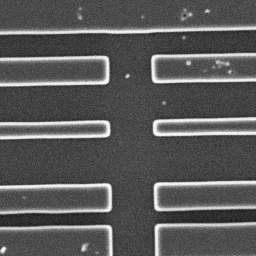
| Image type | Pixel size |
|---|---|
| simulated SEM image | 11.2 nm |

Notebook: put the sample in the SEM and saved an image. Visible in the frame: groups of lines, slits or small figures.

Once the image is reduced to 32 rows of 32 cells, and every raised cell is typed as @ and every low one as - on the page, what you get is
@@@@@@@@@@@@@@@@@@@@@@@@@@@@@@@@
@@@@@@@@@@@@@@@@@@@@@@@@@@@@@@@@
@@@@@@@@@@@@@@@@@@@@@@@@@@@@@@@@
@@@@@@@@@@@@@@@@@@@@@@@@@@@@@@@@
--------------------------------
--------------------------------
--------------------------------
@@@@@@@@@@@@@------@@@@@@@@@@@@@
@@@@@@@@@@@@@------@@@@@@@@@@@@@
@@@@@@@@@@@@@------@@@@@@@@@@@@@
@@@@@---------------------------
--------------------------------
--------------------------------
--------------------------------
--------------------------------
@@@-@@@@@@@@@------@@@@@@@@@@@@@
@@@@@@@@@@@@@@-----@@@@@@@@@@@@@
--------------------------------
--------------------------------
--------------------------------
--------------------------------
--------------------------------
--------------------------------
@@@@@@@@@@@@@@-----@@@@@@@@@@@@@
@@@@@@@@@@@@@@-----@@@@@@@@@@@@@
@@@@@@@@@@@@@@-----@@@@@@@@@@@@@
@@------------------------------
--------------------------------
----@@@@@@@@@@------@@@@@@@@@@@@
@@@@@@@@@@@@@@------@@@@@@@@@@@@
@@@@@@@@@@@@@@------@@@@@@@@@@@@
@@@@@@@@@@@@@@------@@@@@@@@@@@@